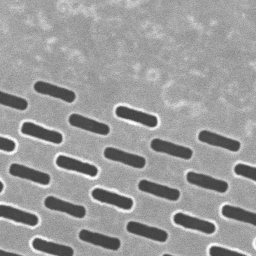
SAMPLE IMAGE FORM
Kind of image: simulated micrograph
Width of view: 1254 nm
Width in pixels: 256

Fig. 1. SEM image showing a regular array of holes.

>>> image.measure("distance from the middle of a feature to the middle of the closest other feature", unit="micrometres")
0.21